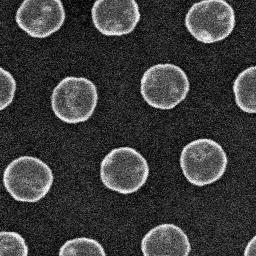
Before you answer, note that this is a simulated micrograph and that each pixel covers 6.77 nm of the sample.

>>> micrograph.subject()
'raised bodies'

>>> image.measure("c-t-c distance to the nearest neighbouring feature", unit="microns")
0.575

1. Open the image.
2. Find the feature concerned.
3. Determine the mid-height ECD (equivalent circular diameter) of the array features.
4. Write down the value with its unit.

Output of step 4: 309 nm